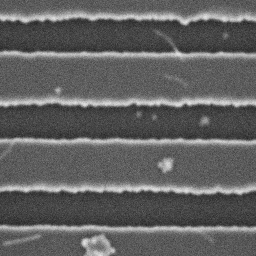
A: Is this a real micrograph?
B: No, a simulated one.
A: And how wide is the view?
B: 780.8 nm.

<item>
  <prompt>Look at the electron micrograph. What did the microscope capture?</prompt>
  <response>lines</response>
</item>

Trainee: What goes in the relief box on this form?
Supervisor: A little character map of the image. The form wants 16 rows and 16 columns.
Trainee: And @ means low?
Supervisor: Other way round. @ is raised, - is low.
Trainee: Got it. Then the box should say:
@@@@@@@@@@@@@@@@
----------------
----------------
@@@@@@@@@@@@@@@@
@@@@@@@@@@@@@@@@
@@@@@@@@@@@@@@@@
@@--@@@@@@@@-@@@
----------------
----------------
@@@@@@@@@@@@@@@@
@@@@@@@@@@@@@@@@
@@@@@@@@@@@@@@@@
----------------
----------------
@@@@@@@@@@@@@@@@
@@@@@@@@@@@@@@@@